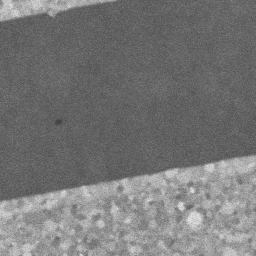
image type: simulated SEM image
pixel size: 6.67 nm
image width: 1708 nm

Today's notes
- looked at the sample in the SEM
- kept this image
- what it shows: one or a few lines or trenches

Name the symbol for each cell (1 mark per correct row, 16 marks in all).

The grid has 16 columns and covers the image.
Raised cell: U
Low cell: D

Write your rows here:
UUDDDDDDDDDDDDDD
DDDDDDDDDDDDDDDD
DDDDDDDDDDDDDDDD
DDDDDDDDDDDDDDDD
DDDDDDDDDDDDDDDD
DDDDDDDDDDDDDDDD
DDDDDDDDDDDDDDDD
DDDDDDDDDDDDDDDD
DDDDDDDDDDDDDDDD
DDDDDDDDDDDDDDDD
DDDDDDDDDDDDDDUU
DDDDDDDDUUUUUUUU
DDDUUUUUUUUUUUUU
UUUUUUUUUUUUUUUU
UUUUUUUUUUUUUUUU
UUUUUUUUUUUUUUUU